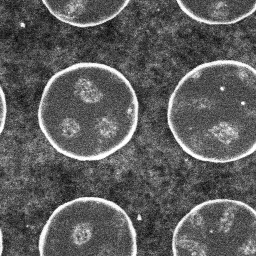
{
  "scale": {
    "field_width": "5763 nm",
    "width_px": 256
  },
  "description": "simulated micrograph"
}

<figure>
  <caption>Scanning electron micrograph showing raised bodies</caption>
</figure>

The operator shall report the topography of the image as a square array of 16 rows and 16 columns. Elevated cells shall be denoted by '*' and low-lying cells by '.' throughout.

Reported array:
...*****...*****
.....*..........
................
................
....***.....****
...*****...*****
...******..*****
..*******..*****
...*****...*****
....***.....****
................
................
.....*..........
...*****....****
...*****...*****
...*****...*****